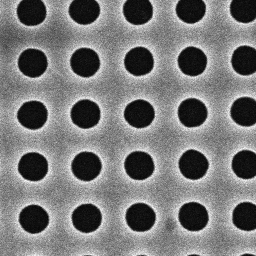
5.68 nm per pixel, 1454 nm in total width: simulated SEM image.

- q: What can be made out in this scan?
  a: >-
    a regular array of holes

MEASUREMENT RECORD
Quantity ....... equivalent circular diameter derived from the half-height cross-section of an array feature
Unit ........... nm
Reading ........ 170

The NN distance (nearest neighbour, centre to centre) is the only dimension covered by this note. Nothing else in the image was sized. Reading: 295 nanometres